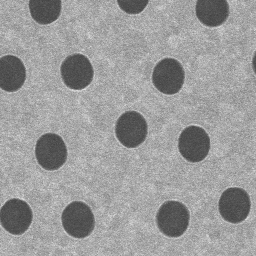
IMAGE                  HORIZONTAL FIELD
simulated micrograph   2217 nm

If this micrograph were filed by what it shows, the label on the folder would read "a regular array of holes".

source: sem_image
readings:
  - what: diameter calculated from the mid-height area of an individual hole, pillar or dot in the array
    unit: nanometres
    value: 299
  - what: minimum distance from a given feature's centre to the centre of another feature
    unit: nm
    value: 559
